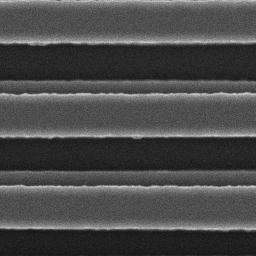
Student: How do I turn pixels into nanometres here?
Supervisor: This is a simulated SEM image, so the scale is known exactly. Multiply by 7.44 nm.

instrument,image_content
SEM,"lines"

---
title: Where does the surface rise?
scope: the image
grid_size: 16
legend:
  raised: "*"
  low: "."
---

****************
****************
****************
................
................
****************
****************
****************
*******.*.*.....
................
................
****************
****************
****************
................
................